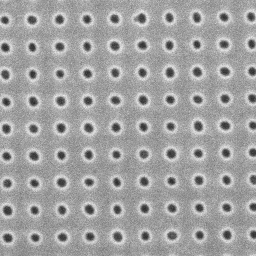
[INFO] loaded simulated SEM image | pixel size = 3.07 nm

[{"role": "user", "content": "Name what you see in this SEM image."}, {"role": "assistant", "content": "a regular array of holes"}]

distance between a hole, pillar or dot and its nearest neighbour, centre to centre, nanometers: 82.9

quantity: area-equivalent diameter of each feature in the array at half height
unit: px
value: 10.5